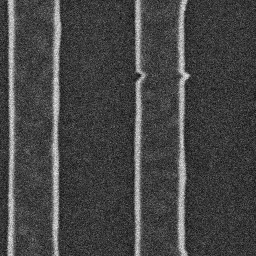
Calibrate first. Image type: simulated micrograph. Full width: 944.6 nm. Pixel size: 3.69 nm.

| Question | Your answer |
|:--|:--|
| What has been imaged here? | one or a few lines or trenches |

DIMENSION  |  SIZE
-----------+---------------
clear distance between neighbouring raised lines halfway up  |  0.293 µm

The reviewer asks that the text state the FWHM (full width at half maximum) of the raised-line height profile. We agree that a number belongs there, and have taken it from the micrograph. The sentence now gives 172 nanometers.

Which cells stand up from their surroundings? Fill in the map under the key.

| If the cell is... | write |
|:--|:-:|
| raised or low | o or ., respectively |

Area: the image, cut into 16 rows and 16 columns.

.ooo.....oo.....
.ooo.....oo.....
.ooo.....oo.....
.ooo.....oo.....
.ooo.....oo.....
.oo......oo.....
.ooo.....oo.....
.ooo.....oo.....
.ooo.....oo.....
.oo......oo.....
.ooo.....oo.....
.ooo.....oo.....
.ooo.....oo.....
.ooo.....oo.....
.ooo.....oo.....
.ooo.....oo.....